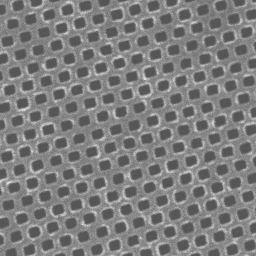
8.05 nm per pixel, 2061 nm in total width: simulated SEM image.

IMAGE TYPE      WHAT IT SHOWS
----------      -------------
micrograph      a regular array of holes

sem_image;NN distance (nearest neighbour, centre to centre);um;0.147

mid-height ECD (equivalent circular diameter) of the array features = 96.1 nanometres